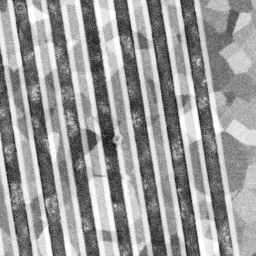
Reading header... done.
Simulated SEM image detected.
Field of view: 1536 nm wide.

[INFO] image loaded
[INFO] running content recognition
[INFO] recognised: parallel lines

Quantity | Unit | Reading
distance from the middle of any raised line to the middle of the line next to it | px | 33.1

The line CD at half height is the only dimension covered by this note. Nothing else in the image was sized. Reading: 0.0934 microns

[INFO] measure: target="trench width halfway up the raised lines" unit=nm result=110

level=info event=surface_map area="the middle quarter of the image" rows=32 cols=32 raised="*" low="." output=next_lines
..****.....***.....****....****.
..****.....***.....****....****.
...***.....***.....****.....***.
...***.....****....****.....****
...***.....****.....***.....****
...****....****.....***.....****
...****.....***.....****....****
...****.....***.....****....****
....***.....****....****....****
....***.....****....****.....***
....***.....****....****.....***
....****....****.....***.....***
....****....****.....****....***
....****.....***.....****....***
....****.....***.....****....***
.....***.....****....****.....**
.....***.....****....****.....**
.....***.....****.....***.....**
.....****....****.....****....**
.....****....****.....****....**
*....****.....***.....****.....*
*.....***.....***.....****.....*
*.....***.....****....****.....*
*.....***.....****.....***.....*
*.....****....****.....***.....*
*.....****.....***.....****....*
**....****.....***.....****....*
**....****.....****....****....*
**.....***.....****....****.....
**.....***.....****....****.....
**.....****....****.....***.....
**.....****....****.....****....